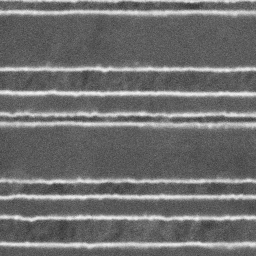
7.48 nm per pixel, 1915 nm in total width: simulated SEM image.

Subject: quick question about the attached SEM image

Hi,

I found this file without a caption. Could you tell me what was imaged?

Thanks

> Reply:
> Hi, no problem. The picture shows lines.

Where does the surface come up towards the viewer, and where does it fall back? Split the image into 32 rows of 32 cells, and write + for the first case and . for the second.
................................
................................
++++++++++++++++++++++++++++++++
++++++++++++++++++++++++++++++++
++++++++++++++++++++++++++++++++
++++++++++++++++++++++++++++++++
++++++++++++++++++++++++++++++++
++++++++++++++++++++++++++++++++
++++++++++++++++++++++++++++++++
................................
................................
................................
++++++++++++++++++++++++++++++++
++++++++++++++++++++++++++++++++
................................
+...+++++++...+++...............
++++++++++++++++++++++++++++++++
++++++++++++++++++++++++++++++++
++++++++++++++++++++++++++++++++
++++++++++++++++++++++++++++++++
++++++++++++++++++++++++++++++++
++++++++++++++++++++++++++++++++
++++++++++++++++++++++++++++++++
................................
................................
++++++++++++++++++++++++++++++++
++++++++++++++++++++++++++++++++
................................
................................
................................
++++..................++++....++
++++++++++++++++++++++++++++++++